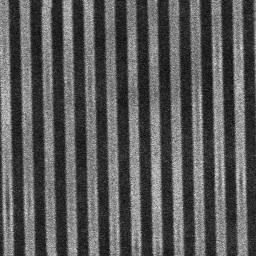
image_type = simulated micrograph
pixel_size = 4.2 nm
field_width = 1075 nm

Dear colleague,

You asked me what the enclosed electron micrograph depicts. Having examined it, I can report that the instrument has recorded parallel lines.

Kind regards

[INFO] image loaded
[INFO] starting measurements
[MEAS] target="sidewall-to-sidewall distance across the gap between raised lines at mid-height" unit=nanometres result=49.3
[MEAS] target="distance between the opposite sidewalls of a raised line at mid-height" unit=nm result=38.8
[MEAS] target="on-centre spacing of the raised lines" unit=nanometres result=89.2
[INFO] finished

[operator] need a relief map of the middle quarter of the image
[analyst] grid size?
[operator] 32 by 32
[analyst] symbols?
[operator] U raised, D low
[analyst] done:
UUDDDUUDDDDUUDDDUUDDDUUDDDDUUDDD
UUDDDUUDDDDUUDDDUUDDDUUDDDDUUDDD
UUDDDUUDDDDUUDDDUUDDDUUDDDDUUDDD
UUDDDUUDDDDUUDDDUUDDDUUDDDDUUDDD
UUDDDUUUDDDUUDDDUUDDDUUDDDDUUDDD
UUDDDUUUDDDUUDDDUUDDDUUDDDDUUDDD
UUDDDUUUDDDUUDDDUUDDDUUUDDDUUDDD
UUDDDUUUDDDUUDDDUUDDDUUUDDDUUDDD
UUDDDDUUDDDUUDDDUUDDDDUUDDDUUDDD
UUDDDDUUDDDUUDDDUUDDDDUUDDDUUDDD
UUDDDDUUDDDUUDDDUUDDDDUUDDDUUDDD
UUDDDDUUDDDUUDDDUUDDDDUUDDDUUDDD
UUDDDDUUDDDUUDDDUUDDDDUUDDDUUDDD
UUDDDDUUDDDUUDDDUUDDDDUUDDDUUDDD
UUDDDDUUDDDUUDDDUUDDDDUUDDDUUDDD
UUDDDDUUDDDUUDDDUUDDDDUUDDDUUDDD
UUUDDDUUDDDUUDDDUUDDDDUUDDDUUDDD
UUUDDDUUDDDUUDDDUUDDDDUUDDDUUDDD
UUUDDDUUDDDUUDDDUUUDDDUUDDDUUDDD
DUUDDDUUDDDUUDDDUUUDDDUUDDDUUDDD
DUUDDDUUDDDUUDDDUUUDDDUUDDDUUDDD
DUUDDDUUDDDUUDDDUUUDDDUUDDDUUDDD
DUUDDDUUDDDUUDDDDUUDDDUUDDDUUDDD
DUUDDDUUDDDUUDDDDUUDDDUUDDDUUDDD
DUUDDDUUDDDUUDDDDUUDDDUUDDDUUDDD
DUUDDDUUDDDUUDDDDUUDDDUUDDDUUDDD
DUUDDDUUDDDUUDDDDUUDDDUUDDDUUDDD
DUUDDDUUDDDUUDDDDUUDDDUUDDDUUDDD
DUUDDDUUDDDUUDDDDUUDDDUUDDDUUDDD
DUUDDDUUDDDUUDDDDUUDDDUUDDDUUDDD
DUUDDDUUDDDUUUDDDUUDDDUUDDDUUDDD
DUUDDDUUDDDUUUDDDUUDDDUUDDDUUDDD